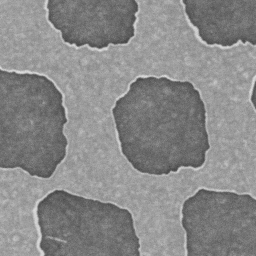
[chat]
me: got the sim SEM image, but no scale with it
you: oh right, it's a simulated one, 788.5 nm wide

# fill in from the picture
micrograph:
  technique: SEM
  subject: holes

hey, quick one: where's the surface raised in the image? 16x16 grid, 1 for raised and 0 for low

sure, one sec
1110000001110000
1110000011110000
1111000011111000
1111111111111111
0111111111111111
0000111100001111
0000111000000111
0000111000000111
0000111000000111
0000111100000111
1000111100011111
1111111111111111
1110001111110000
1100000011100000
1100000011110000
1100000001110000